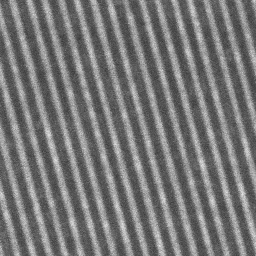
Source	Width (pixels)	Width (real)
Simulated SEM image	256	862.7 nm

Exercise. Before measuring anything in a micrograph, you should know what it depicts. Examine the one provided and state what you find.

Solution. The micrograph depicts parallel lines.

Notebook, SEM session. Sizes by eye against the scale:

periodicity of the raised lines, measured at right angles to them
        52.5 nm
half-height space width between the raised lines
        35.8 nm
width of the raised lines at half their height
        0.0179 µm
